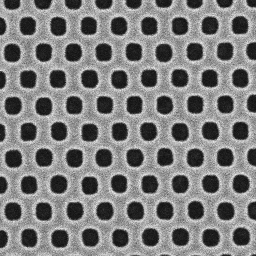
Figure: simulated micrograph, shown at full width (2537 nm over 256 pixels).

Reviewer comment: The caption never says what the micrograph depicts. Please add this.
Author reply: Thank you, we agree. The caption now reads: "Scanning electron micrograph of a regular array of holes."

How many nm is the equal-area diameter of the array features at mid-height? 186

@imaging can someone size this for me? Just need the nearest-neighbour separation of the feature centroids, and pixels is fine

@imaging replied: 29.8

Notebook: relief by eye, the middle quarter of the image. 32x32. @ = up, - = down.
@@@@@@@@@@@@@@@@@@@@@@@@@@@@@@@@
@@@@@--@@@@@@--@@@@@---@@@@@--@@
@@@@----@@@@----@@@----@@@@----@
-@@@-----@@@----@@@----@@@@----@
-@@@----@@@@----@@@----@@@@----@
@@@@@---@@@@----@@@@---@@@@----@
@@@@@@@@@@@@@@@@@@@@@@@@@@@@@@@@
@@@@@@@@@@@@@@@@@@@@@@@@@@@@@@@@
@---@@@@----@@@@---@@@@----@@@@-
-----@@@----@@@@----@@@----@@@@-
-----@@@----@@@@----@@@----@@@@-
-----@@@----@@@@----@@@----@@@@-
@---@@@@@--@@@@@@--@@@@@--@@@@@@
@@@@@@@@@@@@@@@@@@@@@@@@@@@@@@@@
@@@@@@@@@@@@@-@@@@@@-@@@@@@@@@@@
-@@@----@@@@----@@@----@@@@----@
-@@@-----@@@----@@@----@@@@----@
-@@@-----@@@----@@@----@@@@----@
@@@@----@@@@----@@@----@@@@----@
@@@@@@-@@@@@@@@@@@@@@@@@@@@@-@@@
@@@@@@@@@@@@@@@@@@@@@@@@@@@@@@@@
@---@@@@@--@@@@@---@@@@@---@@@@-
-----@@@----@@@@----@@@----@@@@-
-----@@@----@@@-----@@@----@@@@-
@----@@@----@@@@----@@@----@@@@-
@---@@@@@--@@@@@---@@@@@--@@@@@-
@@@@@@@@@@@@@@@@@@@@@@@@@@@@@@@@
@@@@@@@@@@@@@-@@@@@@@@@@@@@@@@@@
-@@@@---@@@@----@@@@---@@@@----@
-@@@-----@@@----@@@-----@@@----@
-@@@-----@@@----@@@-----@@@----@
-@@@-----@@@----@@@----@@@@----@